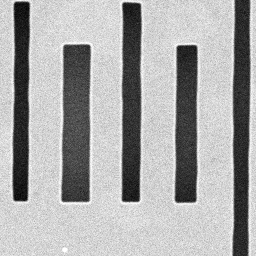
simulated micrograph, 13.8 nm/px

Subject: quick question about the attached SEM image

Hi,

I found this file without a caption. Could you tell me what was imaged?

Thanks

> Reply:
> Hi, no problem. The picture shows groups of lines, slits or small figures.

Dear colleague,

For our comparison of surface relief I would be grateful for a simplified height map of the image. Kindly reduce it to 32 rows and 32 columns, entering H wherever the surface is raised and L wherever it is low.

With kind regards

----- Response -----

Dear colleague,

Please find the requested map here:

HHLLHHHHHHHHHHHLLHHHHHHHHHHHHLLH
HHLLHHHHHHHHHHHLLLHHHHHHHHHHHLLH
HHLLHHHHHHHHHHHLLLHHHHHHHHHHHLLH
HHLLHHHHHHHHHHHLLLHHHHHHHHHHHLLH
HHLLHHHHHHHHHHHLLLHHHHHHHHHHHLLH
HHLLHHHHHLLHHHHLLLHHHHHHHHHHHLLH
HHLLHHHHLLLHHHHLLLHHHHLLLHHHHLLH
HHLLHHHHLLLHHHHLLLHHHHLLLHHHHLLH
HHLLHHHHLLLHHHHLLLHHHHLLLHHHHLLH
HHLLHHHHLLLHHHHLLLHHHHLLLHHHHLLH
HHLLHHHHLLLHHHHLLLHHHHLLLHHHHLLH
HHLLHHHHLLLHHHHLLLHHHHLLLHHHHLLH
HHLLHHHHLLLHHHHLLLHHHHLLLHHHHLLH
HHLLHHHHLLLHHHHLLLHHHHLLLHHHHLLH
HHLLHHHHLLLHHHHLLLHHHHLLLHHHHLLH
HHLLHHHHLLLHHHHLLLHHHHLLLHHHHLLH
HHLLHHHHLLLHHHHLLLHHHHLLLHHHHLLH
HHLLHHHHLLLHHHHLLLHHHHLLLHHHHLLH
HHLLHHHHLLLHHHHLLLHHHHLLLHHHHLLH
HHLLHHHHLLLHHHHLLLHHHHLLLHHHHLLH
HHLLHHHHLLLHHHHLLLHHHHLLLHHHHLLH
HHLLHHHHLLLHHHHLLLHHHHLLLHHHHLLH
HHLLHHHHLLLHHHHLLLHHHHLLLHHHHLLH
HHLLHHHHLLLHHHHLLLHHHHLLLHHHHLLH
HHLLHHHHLLLHHHHLLLHHHHLLLHHHHLLH
HHHHHHHHHHHHHHHHHHHHHHHHHHHHHLLH
HHHHHHHHHHHHHHHHHHHHHHHHHHHHHLLH
HHHHHHHHHHHHHHHHHHHHHHHHHHHHHLLH
HHHHHHHHHHHHHHHHHHHHHHHHHHHHHLLH
HHHHHHHHHHHHHHHHHHHHHHHHHHHHHLLH
HHHHHHHHHHHHHHHHHHHHHHHHHHHHHLLH
HHHHHHHHHHHHHHHHHHHHHHHHHHHHHLLH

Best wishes